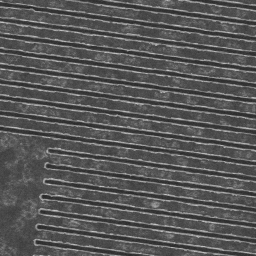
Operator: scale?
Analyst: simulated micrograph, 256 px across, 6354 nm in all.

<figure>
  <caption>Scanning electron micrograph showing parallel lines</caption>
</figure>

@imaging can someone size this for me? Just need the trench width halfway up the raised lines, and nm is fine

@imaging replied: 108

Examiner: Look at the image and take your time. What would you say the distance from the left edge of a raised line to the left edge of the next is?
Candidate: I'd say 382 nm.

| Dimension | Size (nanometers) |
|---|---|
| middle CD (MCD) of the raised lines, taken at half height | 280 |